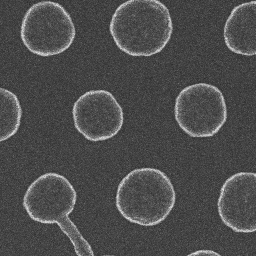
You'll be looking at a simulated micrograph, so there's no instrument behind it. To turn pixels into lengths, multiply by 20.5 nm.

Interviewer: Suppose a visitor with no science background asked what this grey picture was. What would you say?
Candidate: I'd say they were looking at raised bodies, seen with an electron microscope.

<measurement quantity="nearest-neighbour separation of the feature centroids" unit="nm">1990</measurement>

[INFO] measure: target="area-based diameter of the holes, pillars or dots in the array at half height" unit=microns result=1.06